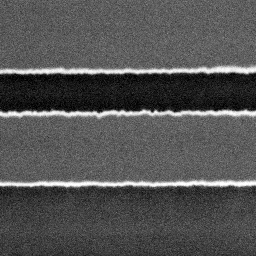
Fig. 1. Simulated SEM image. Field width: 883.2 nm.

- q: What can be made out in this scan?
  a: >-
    lines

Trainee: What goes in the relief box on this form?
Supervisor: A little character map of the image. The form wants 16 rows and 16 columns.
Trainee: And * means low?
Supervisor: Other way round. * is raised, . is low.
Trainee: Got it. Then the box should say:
****************
****************
****************
****************
************...*
................
................
****************
****************
****************
****************
****************
................
................
................
................